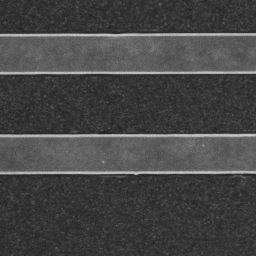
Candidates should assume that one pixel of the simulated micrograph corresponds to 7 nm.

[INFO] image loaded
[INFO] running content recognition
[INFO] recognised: one or a few lines or trenches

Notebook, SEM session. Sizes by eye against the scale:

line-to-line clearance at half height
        437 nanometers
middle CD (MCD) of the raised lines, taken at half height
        270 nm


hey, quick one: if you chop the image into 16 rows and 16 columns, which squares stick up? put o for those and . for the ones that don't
................
................
oooooooooooooooo
oooooooooooooooo
oooooooooooooooo
................
................
................
.....oooo...oooo
oooooooooooooooo
oooooooooooooooo
................
................
................
................
................